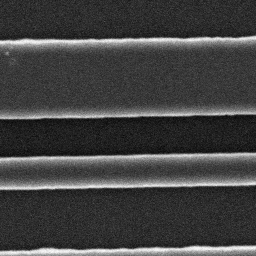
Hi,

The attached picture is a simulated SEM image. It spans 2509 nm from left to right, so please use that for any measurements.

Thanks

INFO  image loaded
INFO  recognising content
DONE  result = lines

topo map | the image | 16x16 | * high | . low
................
................
........********
****************
****************
****************
****************
................
................
................
****************
****************
................
................
................
..............**